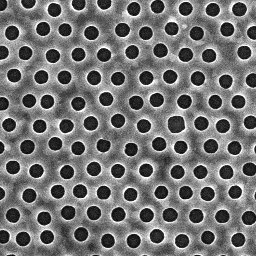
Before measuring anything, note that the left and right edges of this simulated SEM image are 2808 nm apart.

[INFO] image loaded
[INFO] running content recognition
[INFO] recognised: a regular array of holes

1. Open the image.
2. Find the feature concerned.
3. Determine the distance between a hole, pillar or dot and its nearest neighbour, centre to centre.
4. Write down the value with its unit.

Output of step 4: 0.258 micrometres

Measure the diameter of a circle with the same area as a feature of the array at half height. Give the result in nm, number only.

158